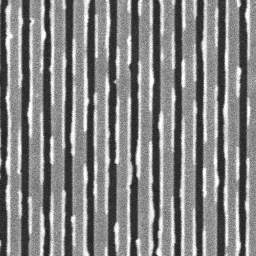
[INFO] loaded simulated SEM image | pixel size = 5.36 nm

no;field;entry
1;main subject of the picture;parallel lines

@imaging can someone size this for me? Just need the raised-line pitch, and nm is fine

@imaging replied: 117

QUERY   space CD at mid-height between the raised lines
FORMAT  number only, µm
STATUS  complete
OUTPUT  0.0415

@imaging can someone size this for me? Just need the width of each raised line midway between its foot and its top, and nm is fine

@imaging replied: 78.3